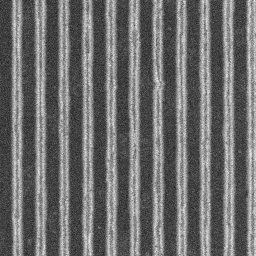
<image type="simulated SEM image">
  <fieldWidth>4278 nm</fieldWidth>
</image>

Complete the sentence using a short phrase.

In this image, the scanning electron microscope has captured parallel lines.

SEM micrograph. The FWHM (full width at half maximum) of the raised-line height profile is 0.13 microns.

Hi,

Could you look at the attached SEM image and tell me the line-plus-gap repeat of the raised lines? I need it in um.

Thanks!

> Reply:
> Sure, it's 0.393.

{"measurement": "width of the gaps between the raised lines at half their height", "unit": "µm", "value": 0.263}